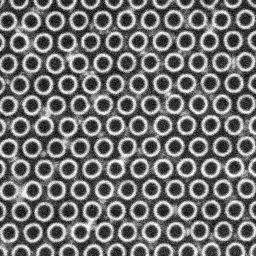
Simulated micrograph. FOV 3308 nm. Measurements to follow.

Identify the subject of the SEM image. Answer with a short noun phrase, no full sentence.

a regular array of raised bodies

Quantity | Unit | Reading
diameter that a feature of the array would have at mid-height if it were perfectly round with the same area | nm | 222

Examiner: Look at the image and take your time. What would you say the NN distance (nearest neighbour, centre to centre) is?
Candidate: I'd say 303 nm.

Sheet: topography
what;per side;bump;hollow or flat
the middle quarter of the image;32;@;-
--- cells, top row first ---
--@@@@--@@@@--@@@---@@@---@@@---
--@@@----@@---@@@----@@---------
--------------------------------
@@----@@----@@---@@@---@@@---@@@
@@@--@@@@--@@@@--@@@@--@@@@--@@@
@@@--@@@@--@@@@--@@@@--@@@@--@@@
@@---@@@---@@@---@@@---@@@---@@@
--------------------------------
---@@----@@----@@----@@---@@@---
--@@@@--@@@@--@@@@--@@@@--@@@@--
--@@@@--@@@@--@@@@--@@@@--@@@@--
--@@@@--@@@---@@@---@@@---@@@---
--------------------------------
------------@@----@-----@@----@@
@@@--@@@@--@@@@--@@@---@@@@--@@@
@@@--@@@@--@@@@--@@@---@@@@--@@@
@@@--@@@@--@@@@--@@@---@@@@--@@@
@@----@-------------------------
--------------------------------
---@@---@@@---@@@@--@@@@--@@@---
--@@@@--@@@@--@@@@--@@@@--@@@@--
--@@@@--@@@@--@@@@--@@@@--@@@@--
---@@---@@@----@@----@@----@@---
--------------------------------
@@----@@----@@----@@----@@----@@
@@@--@@@@--@@@@--@@@@--@@@@--@@@
@@@--@@@@--@@@@--@@@@--@@@@--@@@
@@@--@@@---@@@---@@@---@@@---@@@
--------------------------------
---@@----@@----@@----@@---@@@---
--@@@@--@@@@--@@@@--@@@@--@@@@--
--@@@@--@@@@--@@@@--@@@@--@@@@--